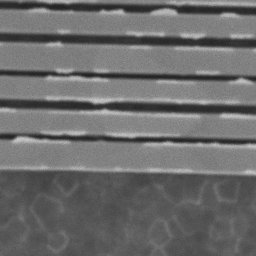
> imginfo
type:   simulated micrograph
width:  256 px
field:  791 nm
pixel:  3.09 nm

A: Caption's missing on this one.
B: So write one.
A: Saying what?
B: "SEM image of parallel lines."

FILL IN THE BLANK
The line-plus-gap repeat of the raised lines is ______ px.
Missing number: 33.2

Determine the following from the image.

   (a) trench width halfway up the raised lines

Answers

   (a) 26.6 nanometres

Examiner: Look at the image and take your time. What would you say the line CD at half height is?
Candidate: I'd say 77.5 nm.